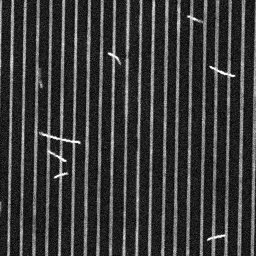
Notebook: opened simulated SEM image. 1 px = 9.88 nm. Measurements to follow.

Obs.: parallel lines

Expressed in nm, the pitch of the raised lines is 127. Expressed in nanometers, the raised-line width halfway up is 27.2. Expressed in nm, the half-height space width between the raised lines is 100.